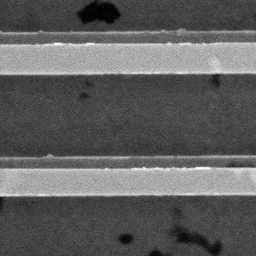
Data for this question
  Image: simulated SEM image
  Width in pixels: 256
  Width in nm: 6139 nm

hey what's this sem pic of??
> lines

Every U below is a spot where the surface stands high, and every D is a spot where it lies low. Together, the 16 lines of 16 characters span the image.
DDDDDDDDDDDDDDDD
DDDDDDDDDDDDDDDD
UUUUUUUUUUUUUUUU
UUUUUUUUUUUUUUUU
UUUUUUUUUUUUUUUU
DDDDDDDDDDDDDDDD
DDDDDDDDDDDDDDDD
DDDDDDDDDDDDDDDD
DDDDDDDDDDDDDDDD
DDDDDDDDDDDDDDDD
UUUUUUUUUUUUUUUU
UUUUUUUUUUUUUUUU
DDDDDDDDDDDDDDDD
DDDDDDDDDDDDDDDD
DDDDDDDDDDDDDDDD
DDDDDDDDDDDDDDDD